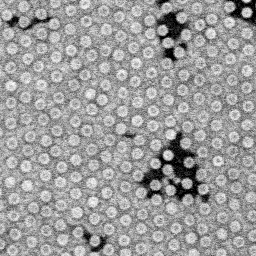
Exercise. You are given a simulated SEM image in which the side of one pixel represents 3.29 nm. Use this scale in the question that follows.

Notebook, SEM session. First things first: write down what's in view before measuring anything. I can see a regular array of raised bodies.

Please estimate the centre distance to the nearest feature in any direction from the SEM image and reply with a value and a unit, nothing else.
51 nanometers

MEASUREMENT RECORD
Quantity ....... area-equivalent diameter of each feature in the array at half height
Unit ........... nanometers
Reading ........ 32.8